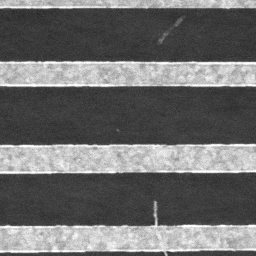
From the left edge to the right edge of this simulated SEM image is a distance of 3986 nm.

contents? lines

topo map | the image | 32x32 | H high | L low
HHHHHHHHHHHHHHHHHHHHHHHHHHHHHHHH
LLLLLLLLLLLLLLLLLLLLLLLLLLLLLLLL
LLLLLLLLLLLLLLLLLLLLLLLLLLLLLLLL
LLLLLLLLLLLLLLLLLLLLLLLLLLLLLLLL
LLLLLLLLLLLLLLLLLLLLLLLLLLLLLLLL
LLLLLLLLLLLLLLLLLLLLLLLLLLLLLLLL
LLLLLLLLLLLLLLLLLLLLLLLLLLLLLLLL
LLLLLLLLLLLLLLLLLLLLLLLLLLLLLLLL
HHHHHHHHHHHHHHHHHHHHHHHHHHHHHHHH
HHHHHHHHHHHHHHHHHHHHHHHHHHHHHHHH
HHHHHHHHHHHHHHHHHHHHHHHHHHHHHHHH
LLLLLLLLLLLLLLLLLLLLLLLLLLLLLLLL
LLLLLLLLLLLLLLLLLLLLLLLLLLLLLLLL
LLLLLLLLLLLLLLLLLLLLLLLLLLLLLLLL
LLLLLLLLLLLLLLLLLLLLLLLLLLLLLLLL
LLLLLLLLLLLLLLLLLLLLLLLLLLLLLLLL
LLLLLLLLLLLLLLLLLLLLLLLLLLLLLLLL
LLLLLLLLLLLLLLLLLLLLLLLLLLLLLLLL
HHHHHHHHHHHHHHHHHHHHHHHHHHHHHHHH
HHHHHHHHHHHHHHHHHHHHHHHHHHHHHHHH
HHHHHHHHHHHHHHHHHHHHHHHHHHHHHHHH
LLLHLLLLLLLLLLLLLLLLLLLLLLLLLLLL
LLLLLLLLLLLLLLLLLLLLLLLLLLLLLLLL
LLLLLLLLLLLLLLLLLLLLLLLLLLLLLLLL
LLLLLLLLLLLLLLLLLLLLLLLLLLLLLLLL
LLLLLLLLLLLLLLLLLLLLLLLLLLLLLLLL
LLLLLLLLLLLLLLLLLLLLLLLLLLLLLLLL
LLLLLLLLLLLLLLLLLLLLLLLLLLLLLLLL
HHHHHHHHHHHHHHHHHHHHHHHHHHHHHHHH
HHHHHHHHHHHHHHHHHHHHHHHHHHHHHHHH
HHHHHHHHHHHHHHHHHHHHHHHHHHHHHHHH
LLLLLLLLLLLLLLLLLLLLLLLLLLLLLLLL